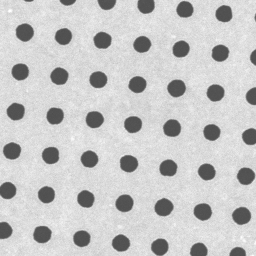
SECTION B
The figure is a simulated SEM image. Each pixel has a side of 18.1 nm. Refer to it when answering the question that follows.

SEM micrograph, a regular array of holes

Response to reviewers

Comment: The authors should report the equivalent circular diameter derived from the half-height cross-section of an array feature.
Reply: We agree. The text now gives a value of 0.321 microns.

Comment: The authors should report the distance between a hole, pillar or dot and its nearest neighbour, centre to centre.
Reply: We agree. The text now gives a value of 710 nanometers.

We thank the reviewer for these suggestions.